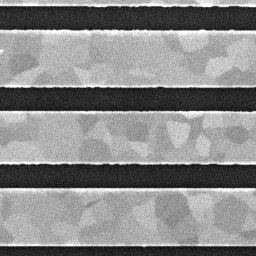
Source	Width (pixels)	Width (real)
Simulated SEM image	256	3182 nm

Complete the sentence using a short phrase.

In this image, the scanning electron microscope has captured lines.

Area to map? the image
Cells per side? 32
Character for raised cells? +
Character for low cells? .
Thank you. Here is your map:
++++++++++++++++++++++++++++++++
................................
................................
................................
++++++++++++++++++++++++++++++++
++++++++++++++++++++++++++++++++
++++++++++++++++++++++++++++++++
++++++++++++++++++++++++++++++++
++++++++++++++++++++++++++++++++
++++++++++++++++++++++++++++++++
++++++++++++++++++++++++++++++++
................................
................................
................................
++++++++++++++++++++++++++++++++
++++++++++++++++++++++++++++++++
++++++++++++++++++++++++++++++++
++++++++++++++++++++++++++++++++
++++++++++++++++++++++++++++++++
++++++++++++++++++++++++++++++++
................................
................................
................................
................................
++++++++++++++++++++++++++++++++
++++++++++++++++++++++++++++++++
++++++++++++++++++++++++++++++++
++++++++++++++++++++++++++++++++
++++++++++++++++++++++++++++++++
++++++++++++++++++++++++++++++++
++++++++++++++++++++++++++++++++
................................